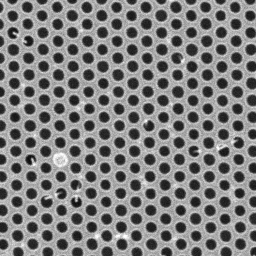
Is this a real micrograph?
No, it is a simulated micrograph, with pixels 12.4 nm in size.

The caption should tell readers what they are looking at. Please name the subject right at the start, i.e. a regular array of holes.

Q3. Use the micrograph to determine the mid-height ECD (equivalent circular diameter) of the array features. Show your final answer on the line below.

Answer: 11.8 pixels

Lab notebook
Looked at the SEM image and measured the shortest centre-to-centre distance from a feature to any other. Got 208 nanometers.